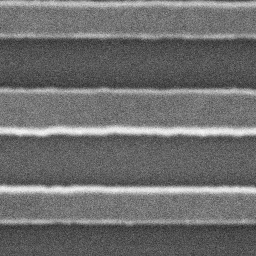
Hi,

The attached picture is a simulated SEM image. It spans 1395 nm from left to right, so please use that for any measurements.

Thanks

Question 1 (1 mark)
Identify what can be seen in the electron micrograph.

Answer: lines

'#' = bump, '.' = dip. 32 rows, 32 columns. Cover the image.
################################
################################
################################
################################
################################
................................
................................
................................
................................
................................
................................
################################
################################
################################
################################
################################
.######.#####...#.####.#########
................................
................................
................................
................................
................................
................................
#############............#......
################################
################################
################################
################################
................................
................................
................................
................................